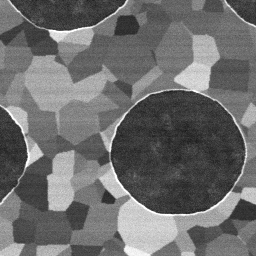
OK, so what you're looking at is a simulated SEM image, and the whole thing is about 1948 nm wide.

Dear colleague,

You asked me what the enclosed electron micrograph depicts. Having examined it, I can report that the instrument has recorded holes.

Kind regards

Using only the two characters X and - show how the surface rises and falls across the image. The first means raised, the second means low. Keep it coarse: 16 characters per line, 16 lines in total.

X------XXXXXXX--
XX----XXXXXXXXXX
XXXXXXXXXXXXXXXX
XXXXXXXXXXXXXXXX
XXXXXXXXXXXXXXXX
XXXXXXXXXXXXXXXX
XXXXXXXXX-----XX
-XXXXXXX-------X
--XXXXX--------X
--XXXXX--------X
--XXXXX--------X
-XXXXXXX-------X
XXXXXXXX------XX
XXXXXXXXXXXXXXXX
XXXXXXXXXXXXXXXX
XXXXXXXXXXXXXXXX